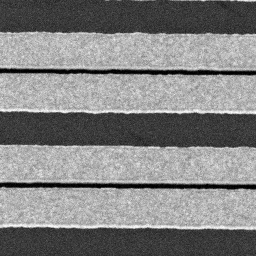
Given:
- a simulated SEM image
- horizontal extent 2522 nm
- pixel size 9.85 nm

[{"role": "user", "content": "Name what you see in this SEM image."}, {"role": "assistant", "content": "lines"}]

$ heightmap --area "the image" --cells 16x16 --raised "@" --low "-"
----------------
----------------
@@@@@@@@@@@@@@@@
@@@@@@@@@@@@@@@@
@@@@@@@@@@@@@@@@
@@@@@@@@@@@@@@@@
@@@@@@@@@@@@@@@@
----------------
----------------
@@@@@@@@@@@@@@@@
@@@@@@@@@@@@@@@@
@@@@@@@@@@@@@@@@
@@@@@@@@@@@@@@@@
@@@@@@@@@@@@@@@@
----------------
----------------